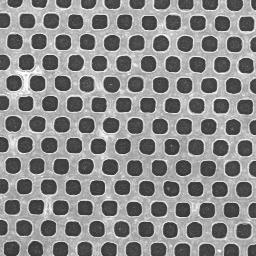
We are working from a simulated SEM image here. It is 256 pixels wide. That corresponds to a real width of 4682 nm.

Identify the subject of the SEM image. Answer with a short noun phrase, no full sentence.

a regular array of holes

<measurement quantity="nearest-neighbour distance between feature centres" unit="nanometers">433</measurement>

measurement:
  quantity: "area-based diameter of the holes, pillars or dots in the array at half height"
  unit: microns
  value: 0.303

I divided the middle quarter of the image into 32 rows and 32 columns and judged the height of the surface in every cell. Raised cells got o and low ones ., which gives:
o....oo....oo....oo....oo....oo.
oo..oooo..oooo..ooo....ooo...ooo
oooooooooooooooooooooooooooooooo
.ooo...ooo...oooo...ooo...ooo..o
..oo....oo....oo....oo....oo....
..oo....oo....oo....oo....oo....
.ooo...ooo....oo....oo....oo....
oooooooooooooooooooooooooooooo.o
o...ooo...oooo..oooo..oooooooooo
o....oo....oo....oo....oo....oo.
o....oo....oo....oo....oo....oo.
o...ooo....oo....oo....oo....oo.
oooooooooooooooooooooooooooooooo
.oooo..oooo..oooo.oooooooooooooo
.ooo....oo....oo....oo....oo....
..oo....oo....oo....oo....oo....
.ooo...ooo....oo....oo....oo....
ooooooooooooooooo..oooo..oooo..o
oo.ooooo.ooooooooooooooooooooooo
o...ooo...ooo....oo....oo....oo.
.....oo....oo....oo....oo....oo.
o...ooo...ooo....oo....oo....oo.
oooooooo.ooooo.ooooo..oooo..ooo.
oooooooooooooooooooooooooooooooo
.ooo...ooo...ooo...ooo...ooo...o
.oo....ooo....oo....oo....oo....
.ooo...ooo....oo....oo....oo....
.ooo..ooooo..ooo....oo...ooo...o
oooooooooooooooooooooooooooooooo
o...ooo...ooo...ooo...ooo..ooooo
....oo....ooo....oo....oo....oo.
....oo....ooo....oo....oo....oo.